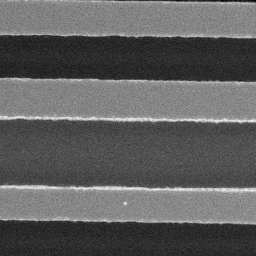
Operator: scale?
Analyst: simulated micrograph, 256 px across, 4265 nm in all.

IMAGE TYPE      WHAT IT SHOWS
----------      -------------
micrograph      lines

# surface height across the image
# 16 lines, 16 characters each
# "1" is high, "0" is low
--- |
1111111111111111
1111111111111111
0000000000000000
0000000000000000
0000000000000000
1111111111111111
1111111111111111
0000000000001111
0000000000000000
0000000000000000
0000000000000000
0000000000000000
1111111111111111
1111111111111111
0000000000000000
0000000000000000